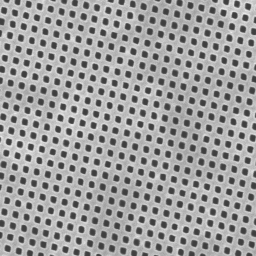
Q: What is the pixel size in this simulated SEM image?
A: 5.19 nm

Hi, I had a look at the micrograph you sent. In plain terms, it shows a regular array of holes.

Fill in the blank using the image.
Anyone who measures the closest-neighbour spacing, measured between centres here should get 57.6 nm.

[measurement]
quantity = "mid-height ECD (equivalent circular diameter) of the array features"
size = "0.0366 um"